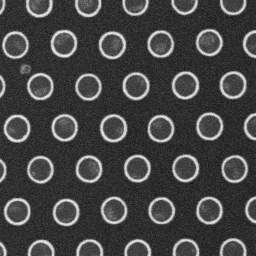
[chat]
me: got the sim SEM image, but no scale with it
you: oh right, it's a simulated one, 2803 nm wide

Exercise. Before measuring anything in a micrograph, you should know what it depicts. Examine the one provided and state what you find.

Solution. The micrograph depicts a regular array of raised bodies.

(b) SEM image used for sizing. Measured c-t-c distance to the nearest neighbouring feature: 520 nm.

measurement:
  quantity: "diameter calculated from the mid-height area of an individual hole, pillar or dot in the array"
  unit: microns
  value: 0.269